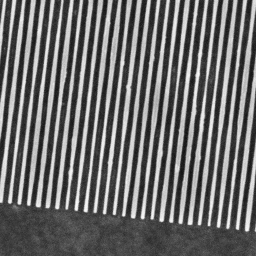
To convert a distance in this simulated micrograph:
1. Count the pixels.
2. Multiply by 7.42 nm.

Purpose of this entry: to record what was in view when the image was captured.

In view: parallel lines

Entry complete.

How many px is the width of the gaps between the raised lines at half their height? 5.58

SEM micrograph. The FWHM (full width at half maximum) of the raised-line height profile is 27.6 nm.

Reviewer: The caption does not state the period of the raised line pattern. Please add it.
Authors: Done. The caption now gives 70.9 nanometers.